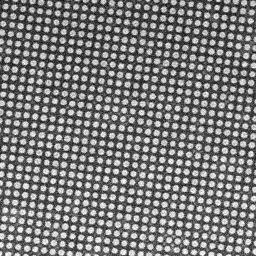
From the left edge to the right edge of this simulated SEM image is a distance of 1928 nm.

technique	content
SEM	a regular array of raised bodies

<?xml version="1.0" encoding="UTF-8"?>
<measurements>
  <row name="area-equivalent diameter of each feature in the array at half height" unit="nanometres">39.8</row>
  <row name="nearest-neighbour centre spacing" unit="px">8.38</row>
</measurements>